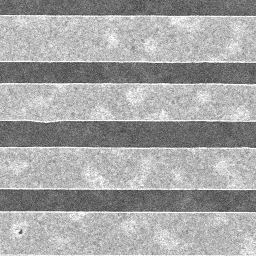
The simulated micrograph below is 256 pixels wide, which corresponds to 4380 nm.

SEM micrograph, one or a few lines or trenches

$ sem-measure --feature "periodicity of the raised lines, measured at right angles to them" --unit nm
1110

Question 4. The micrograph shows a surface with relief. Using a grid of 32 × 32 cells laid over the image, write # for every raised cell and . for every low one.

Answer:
................................
................................
################################
################################
################################
################################
################################
################################
................................
................................
...##...#######.................
################################
################################
################################
################################
................................
................................
................................
###############...............#.
################################
################################
################################
################################
################################
................................
................................
................................
################################
################################
################################
################################
################################